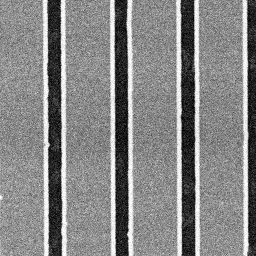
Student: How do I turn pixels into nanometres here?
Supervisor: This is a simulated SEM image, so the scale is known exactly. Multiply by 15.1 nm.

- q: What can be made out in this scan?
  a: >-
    one or a few lines or trenches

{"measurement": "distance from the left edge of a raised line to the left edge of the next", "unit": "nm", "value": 1000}